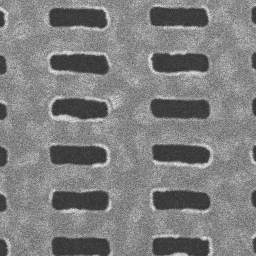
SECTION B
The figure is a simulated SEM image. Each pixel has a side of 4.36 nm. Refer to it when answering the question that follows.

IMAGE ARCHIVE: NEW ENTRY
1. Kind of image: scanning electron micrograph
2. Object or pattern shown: a regular array of holes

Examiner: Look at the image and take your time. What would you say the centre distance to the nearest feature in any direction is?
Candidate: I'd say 45.5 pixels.